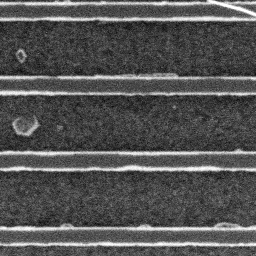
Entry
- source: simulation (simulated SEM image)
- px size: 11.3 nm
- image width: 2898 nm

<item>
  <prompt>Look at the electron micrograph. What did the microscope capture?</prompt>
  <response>lines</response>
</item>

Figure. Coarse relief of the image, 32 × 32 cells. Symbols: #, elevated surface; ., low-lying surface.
################################
################################
#...#.........##....#.......#.##
................................
................................
................................
................................
................................
................................
................................
################################
################################
................................
................................
................................
................................
................................
................................
................................
################################
################################
................................
................................
................................
................................
................................
................................
................................
................................
################################
################################
................................